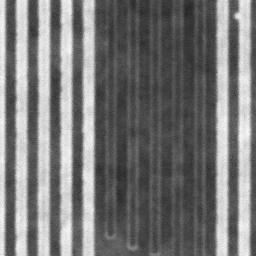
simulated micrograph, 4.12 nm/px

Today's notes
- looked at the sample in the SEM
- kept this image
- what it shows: parallel lines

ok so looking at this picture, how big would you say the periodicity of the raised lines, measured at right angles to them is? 91.8 nm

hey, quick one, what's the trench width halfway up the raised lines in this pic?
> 56.1 nanometers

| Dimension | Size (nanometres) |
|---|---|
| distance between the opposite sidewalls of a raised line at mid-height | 36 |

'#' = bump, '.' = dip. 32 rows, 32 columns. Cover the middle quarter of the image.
##...##....##...##....##...##...
##...##....##...##....##...##...
##...##....##...##....##...##...
##...##....##...##....##...##...
##...##....##...##....##...##...
##...##....##...##....##...##...
##...##....##...##....##...##...
##...##....##...##....##...##...
##...##....##...##....##...##...
##...##....##...##....##...##...
##...##....##...##....##...##...
#....##....##...##....##...##...
##...##....##...##....##...##...
##...##....##...##....##...##...
#....##....##...##....##...##...
##...##....##...##....##...##...
##...##....##...##....##...##...
#....##....##...##....##...##...
#....##....##...##....##...##...
#....##....##...##....##...##...
##...##....##...##....##...##...
##...##....##...##....##...##...
##...##....##...##....##...##...
#....##....##...##....##...##...
#....##....##...##....##...##...
#....##....##...##....##...##...
#....##....##...##....##...##...
#....##....##...##....##...##...
##...##....##...##....##...##...
##...##....##...##....##...##...
#....##....##...##....##...##...
#....##....##...##....##...##...